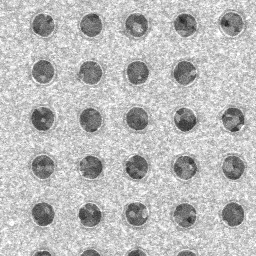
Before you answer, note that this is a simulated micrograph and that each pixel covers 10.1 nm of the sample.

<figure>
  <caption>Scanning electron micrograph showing a regular array of raised bodies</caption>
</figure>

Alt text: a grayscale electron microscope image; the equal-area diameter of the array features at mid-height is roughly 250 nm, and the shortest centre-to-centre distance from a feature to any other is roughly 46.6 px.